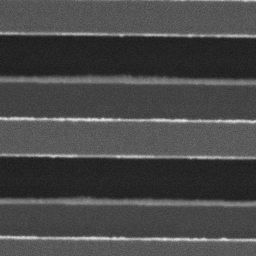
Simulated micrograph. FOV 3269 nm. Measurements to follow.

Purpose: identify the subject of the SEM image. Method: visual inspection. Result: lines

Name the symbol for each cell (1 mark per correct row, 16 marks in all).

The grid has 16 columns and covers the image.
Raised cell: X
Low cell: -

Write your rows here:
XXXXXXXXXXXXXXXX
XXXXXXXXXXXXXXXX
----------------
----------------
----------------
XXXXXXXXXXXXXXXX
XXXXXXXXXXXXXXXX
XXXXXXXXXXXXXXXX
XXXXXXXXXXXXXXXX
XXXXXXXXXXXXXXXX
----------------
----------------
----------------
XXXXXXXXXXXXXXXX
XXXXXXXXXXXXXXXX
XXXXXXXXXXXXXXXX